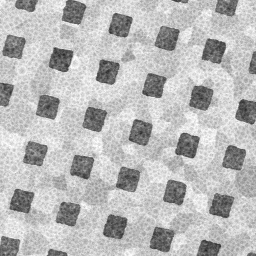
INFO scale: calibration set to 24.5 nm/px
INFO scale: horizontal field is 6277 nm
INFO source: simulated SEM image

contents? a regular array of holes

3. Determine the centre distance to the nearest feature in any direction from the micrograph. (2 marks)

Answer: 1180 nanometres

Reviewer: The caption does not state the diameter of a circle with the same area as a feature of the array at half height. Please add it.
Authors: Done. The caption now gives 0.576 microns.